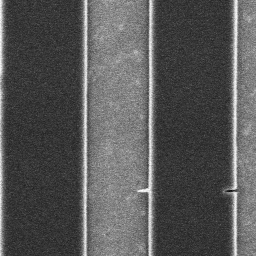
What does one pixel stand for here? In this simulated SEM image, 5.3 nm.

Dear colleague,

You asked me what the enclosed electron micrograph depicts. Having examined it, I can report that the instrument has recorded one or a few lines or trenches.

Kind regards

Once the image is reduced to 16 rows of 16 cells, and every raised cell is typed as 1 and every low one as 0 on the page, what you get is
1111100001111110
1111100001111110
1111100001111110
1111100001111110
1111100001111110
1111100001111110
1111100001111110
1111100001111110
1111100001111110
1111100001111110
1111100001111110
1111100001111110
1111100001111110
1111100001111110
1111100001111110
1111100001111110